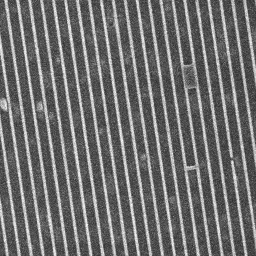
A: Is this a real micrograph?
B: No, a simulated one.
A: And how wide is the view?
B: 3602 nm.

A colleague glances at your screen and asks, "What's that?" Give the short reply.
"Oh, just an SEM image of parallel lines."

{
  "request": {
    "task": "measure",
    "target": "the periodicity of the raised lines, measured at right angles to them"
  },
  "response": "166 nm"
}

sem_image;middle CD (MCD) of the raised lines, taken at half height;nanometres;27.8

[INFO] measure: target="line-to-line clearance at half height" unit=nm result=143